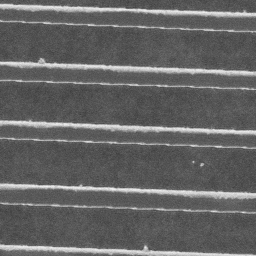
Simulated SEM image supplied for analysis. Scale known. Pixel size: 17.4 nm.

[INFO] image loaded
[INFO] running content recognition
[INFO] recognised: lines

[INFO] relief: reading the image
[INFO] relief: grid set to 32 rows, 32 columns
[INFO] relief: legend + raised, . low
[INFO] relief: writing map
................................
+++++++++++++++++++++...........
++++++++++++++++++++++++++++++++
....................++++++++++++
................................
................................
................................
................................
+++++++++++++++.................
++++++++++++++++++++++++++++++++
............++++++++++++++++++++
................................
................................
................................
................................
++++............................
+++++++++++++++++++++++++++++...
....++++++++++++++++++++++++++++
................................
................................
................................
................................
................................
+++++++++.......................
++++++++++++++++++++++++++++++++
..++++++++++++++++++++++++++++++
..............................++
................................
................................
................................
................................
++++++++++++++++++..............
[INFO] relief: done